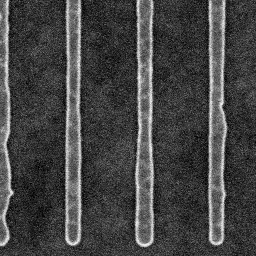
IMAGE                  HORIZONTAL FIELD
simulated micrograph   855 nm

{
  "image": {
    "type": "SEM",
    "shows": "one or a few lines or trenches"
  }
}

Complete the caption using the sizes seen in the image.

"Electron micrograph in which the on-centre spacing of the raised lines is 240 nm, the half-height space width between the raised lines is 195 nanometers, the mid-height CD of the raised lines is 45.6 nm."